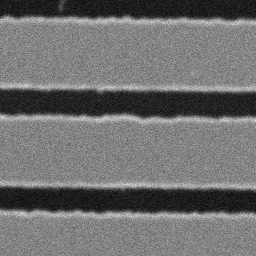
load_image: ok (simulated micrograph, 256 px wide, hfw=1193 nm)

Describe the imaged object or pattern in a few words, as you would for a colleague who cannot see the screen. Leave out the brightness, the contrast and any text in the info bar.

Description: lines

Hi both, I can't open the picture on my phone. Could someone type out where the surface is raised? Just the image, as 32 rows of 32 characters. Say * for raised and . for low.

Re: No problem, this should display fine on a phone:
................................
................................
***********.******.*.***..**....
********************************
********************************
********************************
********************************
********************************
********************************
********************************
********************************
................................
................................
................................
*.*.****.....*.*................
********************************
********************************
********************************
********************************
********************************
********************************
********************************
********************************
..............................**
................................
................................
***.**..........................
********************************
********************************
********************************
********************************
********************************